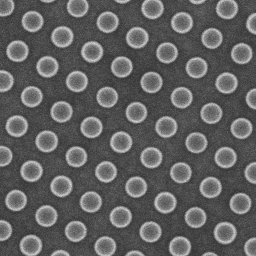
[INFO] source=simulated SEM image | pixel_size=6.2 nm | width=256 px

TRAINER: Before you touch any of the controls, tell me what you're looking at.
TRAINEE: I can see a regular array of raised bodies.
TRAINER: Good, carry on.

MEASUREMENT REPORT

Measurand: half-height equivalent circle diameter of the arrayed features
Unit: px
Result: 20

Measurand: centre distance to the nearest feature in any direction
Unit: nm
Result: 205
